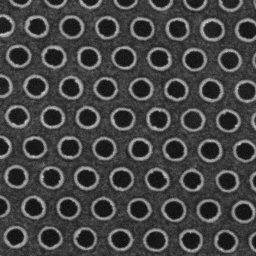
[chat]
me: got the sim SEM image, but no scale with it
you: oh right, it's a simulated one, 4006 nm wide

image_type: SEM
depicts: a regular array of raised bodies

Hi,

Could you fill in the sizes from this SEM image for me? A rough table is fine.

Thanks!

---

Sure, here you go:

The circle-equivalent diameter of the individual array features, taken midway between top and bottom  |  341 nanometers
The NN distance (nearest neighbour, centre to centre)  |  0.542 um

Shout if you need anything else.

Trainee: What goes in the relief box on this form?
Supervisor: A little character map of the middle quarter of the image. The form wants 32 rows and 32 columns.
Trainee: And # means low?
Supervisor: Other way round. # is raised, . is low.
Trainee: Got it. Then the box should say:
.....###.....####.....####....##
................................
................................
.##.............................
####....#####....####.....####..
####....#####....#####....#####.
####....#####....#####...######.
####....#####....#####...######.
.........###......###......###..
................................
................................
....###......###......###......#
....####....#####....#####....##
...######...######...#####...###
...######...#####....#####....##
....####.....####....#####....##
.......................##.......
................................
.........##.....................
####....####.....####.....###...
####....#####....#####...#####..
####....#####...######...#####..
####....#####....#####...#####..
.#.......###......##......####..
................................
................................
....###......###......##........
...#####....#####....####.....##
...#####....#####....#####...###
...#####....#####....#####...###
....####....####.....#####....##
...............................#